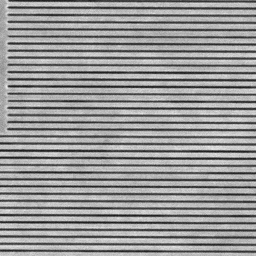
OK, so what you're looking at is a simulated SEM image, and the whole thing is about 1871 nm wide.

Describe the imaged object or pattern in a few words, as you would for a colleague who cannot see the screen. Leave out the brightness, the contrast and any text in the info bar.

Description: parallel lines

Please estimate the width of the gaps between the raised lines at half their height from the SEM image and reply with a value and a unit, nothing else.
13.7 nanometres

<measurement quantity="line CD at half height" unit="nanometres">33.8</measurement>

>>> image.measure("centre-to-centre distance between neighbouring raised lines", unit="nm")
52.4